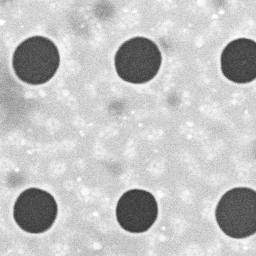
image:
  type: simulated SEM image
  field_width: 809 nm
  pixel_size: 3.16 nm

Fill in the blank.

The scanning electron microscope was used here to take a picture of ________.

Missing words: holes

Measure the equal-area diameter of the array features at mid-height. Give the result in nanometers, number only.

146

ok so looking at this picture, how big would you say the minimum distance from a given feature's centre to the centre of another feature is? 0.322 µm